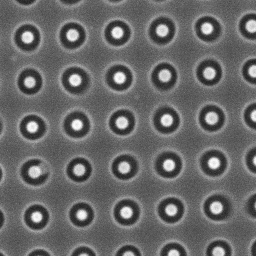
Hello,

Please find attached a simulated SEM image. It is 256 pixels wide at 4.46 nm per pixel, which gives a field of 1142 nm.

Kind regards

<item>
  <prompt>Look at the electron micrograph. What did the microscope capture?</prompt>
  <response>an array of small figures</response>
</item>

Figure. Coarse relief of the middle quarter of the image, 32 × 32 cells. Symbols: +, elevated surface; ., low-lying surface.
++++++++++++....+++++++....+++++
.....++++++......+++++......++++
......++++...+...+++++..++..++++
..++..++++...++..+++++..+++.++++
..++...+++...+...+++++......++++
......+++++......+++++......++++
......++++++....++++++++..++++++
++...+++++++++++++++++++++++++++
++++++++++++++++++++++++++++++++
++++++++++++++++++++++++++++++++
+++++++++++++++++++++++++..+++++
+++++++++++++...+++++++.....++++
+....+++++++.....+++++.......+++
......+++++...+...++++...++..+++
..++...++++..+++..++++...++..+++
..++...++++..++...++++.......+++
.......+++++.....++++++.....++++
......+++++++....+++++++...+++++
++...+++++++++++++++++++++++++++
++++++++++++++++++++++++++++++++
++++++++++++++++++++++++++++++++
++++++++++++++++++++++++++++++++
+++++++++++++++.++++++++....++++
++...++++++++.....+++++......+++
+.....++++++......+++++..++...++
+..++..+++++..++...++++..++...++
..+++..+++++..++...++++......+++
+..++..+++++......+++++......+++
+.....+++++++....++++++++...++++
+++..+++++++++++++++++++++++++++
++++++++++++++++++++++++++++++++
++++++++++++++++++++++++++++++++